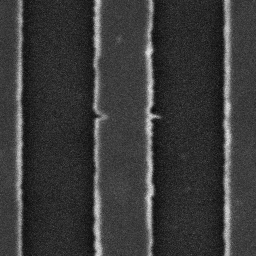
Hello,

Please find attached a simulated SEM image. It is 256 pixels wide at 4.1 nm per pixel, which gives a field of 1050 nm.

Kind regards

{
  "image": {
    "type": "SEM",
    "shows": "one or a few lines or trenches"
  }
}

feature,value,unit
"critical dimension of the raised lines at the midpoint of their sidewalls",55.5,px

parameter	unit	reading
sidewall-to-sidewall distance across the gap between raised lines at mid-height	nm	305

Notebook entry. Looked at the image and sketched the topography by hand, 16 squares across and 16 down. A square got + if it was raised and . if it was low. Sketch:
+.....++++....++
+.....+++.....++
+.....+++.....++
+.....+++.....++
+.....+++.....++
+.....+++.....++
+.....+++.....++
+.....++++....++
+.....+++.....++
+.....+++.....++
+.....+++.....++
+.....+++.....++
+.....+++.....++
+.....+++.....++
+.....+++.....++
+.....+++.....++